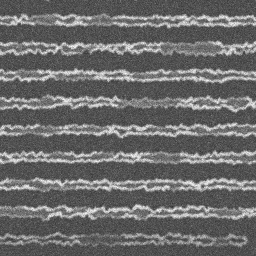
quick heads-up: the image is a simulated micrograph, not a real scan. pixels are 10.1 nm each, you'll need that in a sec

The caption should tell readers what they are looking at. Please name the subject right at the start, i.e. parallel lines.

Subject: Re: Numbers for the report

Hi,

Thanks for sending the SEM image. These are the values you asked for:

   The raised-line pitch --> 275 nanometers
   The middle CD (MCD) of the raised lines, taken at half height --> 89.3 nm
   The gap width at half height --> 186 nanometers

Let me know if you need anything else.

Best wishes